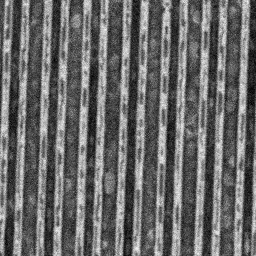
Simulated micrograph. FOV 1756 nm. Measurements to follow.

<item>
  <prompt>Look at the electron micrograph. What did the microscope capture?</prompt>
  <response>parallel lines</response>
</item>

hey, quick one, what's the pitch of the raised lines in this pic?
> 136 nanometres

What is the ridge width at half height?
45.4 nm